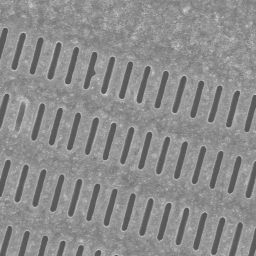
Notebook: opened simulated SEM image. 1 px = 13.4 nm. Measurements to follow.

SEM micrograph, a regular array of holes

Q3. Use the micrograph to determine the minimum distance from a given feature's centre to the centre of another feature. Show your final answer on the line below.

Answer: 18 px